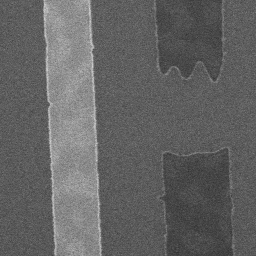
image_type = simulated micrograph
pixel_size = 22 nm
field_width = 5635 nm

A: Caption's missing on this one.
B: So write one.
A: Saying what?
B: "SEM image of one or a few lines or trenches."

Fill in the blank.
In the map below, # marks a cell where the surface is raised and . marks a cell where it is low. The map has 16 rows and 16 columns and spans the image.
...###....####..
...###....####..
...###....####..
...###....####..
...###.....#.#..
...###..........
...###..........
...###..........
...###..........
...###.......#..
...###....####..
...###....####..
...###....####..
...###....#####.
...###....#####.
...###....#####.